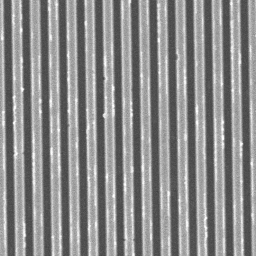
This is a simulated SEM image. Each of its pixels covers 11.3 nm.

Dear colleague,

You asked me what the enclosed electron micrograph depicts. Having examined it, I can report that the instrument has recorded parallel lines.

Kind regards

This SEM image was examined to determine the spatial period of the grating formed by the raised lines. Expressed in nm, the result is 206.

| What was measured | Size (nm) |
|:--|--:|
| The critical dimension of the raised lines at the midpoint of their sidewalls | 107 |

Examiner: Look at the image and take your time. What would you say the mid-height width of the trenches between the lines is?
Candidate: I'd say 0.0974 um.